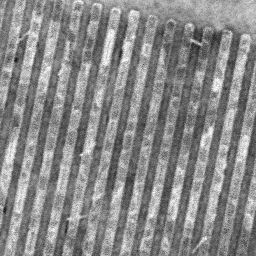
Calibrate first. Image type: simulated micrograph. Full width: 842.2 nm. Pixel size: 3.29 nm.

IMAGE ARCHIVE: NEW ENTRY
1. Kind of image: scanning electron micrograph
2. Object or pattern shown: parallel lines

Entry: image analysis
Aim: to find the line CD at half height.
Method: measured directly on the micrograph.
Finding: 28.3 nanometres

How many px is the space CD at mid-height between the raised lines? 10.3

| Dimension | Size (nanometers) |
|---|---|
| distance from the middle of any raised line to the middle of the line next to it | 62.4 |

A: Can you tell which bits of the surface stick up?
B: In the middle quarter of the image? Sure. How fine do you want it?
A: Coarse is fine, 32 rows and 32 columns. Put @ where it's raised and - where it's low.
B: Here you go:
@@--@@---@@---@@---@@---@@--@@@-
@---@@---@@---@@---@@--@@---@@@-
@---@@---@@---@@--@@---@@---@@--
@---@@---@@--@@@--@@---@@---@@--
@---@@--@@@--@@---@@---@@---@@--
@--@@---@@---@@---@@---@@--@@@--
---@@---@@---@@---@@--@@---@@@--
---@@---@@---@@--@@---@@---@@---
---@@---@@--@@@--@@---@@---@@---
---@@--@@@--@@---@@---@@---@@--@
--@@---@@---@@---@@---@@--@@@--@
--@@---@@---@@---@@--@@---@@---@
--@@---@@---@@--@@---@@---@@---@
--@@---@@--@@@--@@---@@---@@---@
--@@--@@@--@@---@@---@@---@@--@@
-@@---@@---@@---@@---@@--@@@--@@
-@@---@@---@@---@@--@@@--@@@--@@
-@@---@@---@@--@@---@@@--@@---@@
-@@---@@--@@@--@@---@@---@@---@@
-@@--@@@--@@---@@---@@---@@--@@@
@@---@@---@@---@@---@@--@@@--@@@
@@---@@---@@---@@--@@---@@@--@@-
@@--@@@---@@--@@---@@---@@---@@-
@@---@@--@@@--@@---@@---@@---@@-
@@--@@---@@---@@---@@---@@--@@@-
@---@@---@@---@@---@@--@@@--@@@-
@---@@---@@---@@--@@@--@@@--@@--
@---@@---@@--@@---@@---@@---@@--
@---@@--@@@--@@---@@---@@---@@--
@--@@---@@---@@---@@---@@--@@@--
---@@---@@---@@---@@--@@@--@@@--
---@@---@@---@@--@@@--@@@--@@---